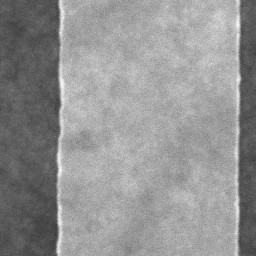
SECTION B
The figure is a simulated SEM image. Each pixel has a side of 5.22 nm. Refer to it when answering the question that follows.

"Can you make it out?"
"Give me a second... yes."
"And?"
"one or a few lines or trenches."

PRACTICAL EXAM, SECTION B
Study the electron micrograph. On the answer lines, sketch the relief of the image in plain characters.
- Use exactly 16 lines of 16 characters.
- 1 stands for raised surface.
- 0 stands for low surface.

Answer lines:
0000111111111110
0000111111111110
0000111111111110
0000111111111110
0000111111111110
0000111111111110
0000111111111110
0000111111111110
0000111111111110
0000111111111110
0000111111111110
0000111111111110
0000111111111110
0000111111111110
0000111111111110
0000111111111110